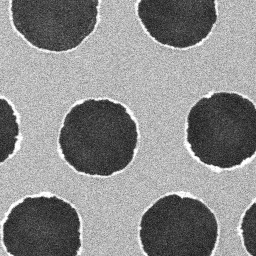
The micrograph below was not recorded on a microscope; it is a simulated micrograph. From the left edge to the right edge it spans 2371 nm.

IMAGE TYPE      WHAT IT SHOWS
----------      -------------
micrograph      holes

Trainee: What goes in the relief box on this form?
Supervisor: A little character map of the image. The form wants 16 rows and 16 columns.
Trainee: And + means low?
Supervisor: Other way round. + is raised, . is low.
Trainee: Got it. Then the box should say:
+.....+++....+++
+.....+++....+++
++...+++++...+++
++++++++++++++++
++++++++++++++++
++++++++++++++++
.++++..+++++....
.+++....++++....
.+++.....+++....
.+++....++++....
+++++...++++++++
++++++++++++++++
++..++++++..++++
.....++++....++.
.....++++.....+.
.....++++....++.